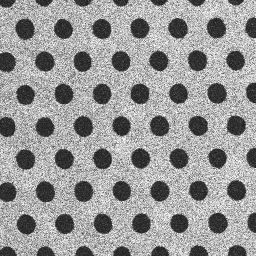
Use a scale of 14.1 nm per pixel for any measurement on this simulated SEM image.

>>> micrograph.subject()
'a regular array of holes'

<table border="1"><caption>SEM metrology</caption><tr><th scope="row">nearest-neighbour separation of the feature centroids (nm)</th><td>527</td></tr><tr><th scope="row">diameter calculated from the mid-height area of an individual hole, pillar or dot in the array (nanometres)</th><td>274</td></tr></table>